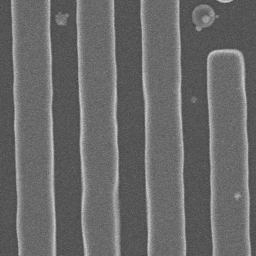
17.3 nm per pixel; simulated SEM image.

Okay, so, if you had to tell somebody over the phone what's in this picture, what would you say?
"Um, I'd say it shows groups of lines, slits or small figures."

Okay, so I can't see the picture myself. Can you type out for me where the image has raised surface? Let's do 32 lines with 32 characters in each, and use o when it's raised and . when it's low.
..oooo....oooo....oooo..........
..oooo....oooo....oooo..ooo.....
..oooo....oooo....oooo..ooo.....
..oooo....oooo....oooo..........
..oooo....oooo....oooo..........
..oooo....oooo....oooo..........
..oooo....oooo....oooo.....ooo..
..oooo....oooo....oooo....oooo..
..oooo....oooo....ooooo...oooo..
..oooo....oooo....ooooo...oooo..
..oooo....oooo....ooooo...ooooo.
..oooo....oooo....oooo....ooooo.
..oooo....oooo....oooo....ooooo.
..oooo....oooo....ooooo...ooooo.
..oooo....oooo....ooooo...ooooo.
..oooo....oooo....ooooo...ooooo.
..oooo....ooooo...ooooo...ooooo.
..oooo....ooooo...ooooo...ooooo.
..ooooo...ooooo...ooooo...ooooo.
..ooooo...ooooo...ooooo...ooooo.
..ooooo...ooooo...ooooo...ooooo.
..ooooo...ooooo...ooooo...ooooo.
..oooo....ooooo...ooooo...ooooo.
..ooooo...ooooo...ooooo...ooooo.
..ooooo...oooo....ooooo...ooooo.
..ooooo...ooooo....oooo...ooooo.
..ooooo...ooooo....oooo...ooooo.
..ooooo...ooooo....oooo...ooooo.
..ooooo...ooooo....oooo...ooooo.
..ooooo...ooooo....oooo....oooo.
..ooooo....oooo....oooo....oooo.
..ooooo....oooo....oooo....oooo.